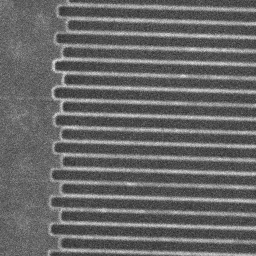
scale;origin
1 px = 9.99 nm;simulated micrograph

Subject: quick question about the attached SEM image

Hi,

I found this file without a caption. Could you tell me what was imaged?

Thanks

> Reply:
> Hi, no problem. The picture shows parallel lines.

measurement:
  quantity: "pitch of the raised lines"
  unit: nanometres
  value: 136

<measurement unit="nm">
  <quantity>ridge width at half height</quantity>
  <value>20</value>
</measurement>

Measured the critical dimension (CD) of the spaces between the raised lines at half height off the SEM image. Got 112 nanometres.